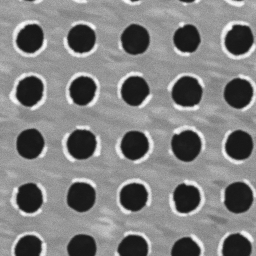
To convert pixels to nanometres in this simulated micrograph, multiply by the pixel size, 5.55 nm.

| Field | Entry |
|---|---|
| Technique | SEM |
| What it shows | a regular array of holes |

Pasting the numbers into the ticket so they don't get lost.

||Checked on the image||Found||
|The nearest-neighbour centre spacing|51.5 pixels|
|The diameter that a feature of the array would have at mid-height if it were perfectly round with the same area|161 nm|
